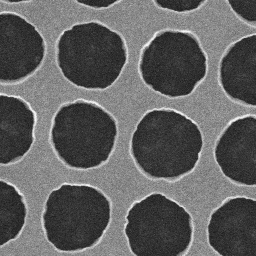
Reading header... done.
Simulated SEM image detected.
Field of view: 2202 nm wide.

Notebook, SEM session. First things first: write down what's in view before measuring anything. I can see holes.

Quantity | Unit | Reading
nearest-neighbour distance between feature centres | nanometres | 696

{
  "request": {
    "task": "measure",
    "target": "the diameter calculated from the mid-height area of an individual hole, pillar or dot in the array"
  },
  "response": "575 nanometres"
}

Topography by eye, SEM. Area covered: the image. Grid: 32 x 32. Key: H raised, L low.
HHHHHHHHHHHLLLHHHHHHLLLLLHHHHLLL
HHHHHHHHHHHHHHHHHHHHHHHHHHHHHLLL
LLLHHHHHHHHHHHHHHHHHHHHHHHHHHHHL
LLLLHHHHHLLLLHHHHHHHHHHHHHHHHHHH
LLLLLHHHLLLLLLLHHHHHLLLLHHHHHHHL
LLLLLHHLLLLLLLLLHHHLLLLLLHHHHLLL
LLLLLHHLLLLLLLLLHHLLLLLLLHHHLLLL
LLLLLHHLLLLLLLLLHHLLLLLLLLHHLLLL
LLLLLHHHLLLLLLLHHHLLLLLLLLHLLLLL
LLLHHHHHLLLLLLLHHHLLLLLLLHHHLLLL
HHHHHHHHHLLLLLHHHHLLLLLLLHHHLLLL
HHHHHHHHHHHHHHHHHHHHLLLLHHHHLLLL
LLLHHHHHHHHHHHHHHHHHHHHHHHHHHLLL
LLLLHHHHLLLLHHHHHHHHHHHHHHHHHHHH
LLLLHHHLLLLLLLHHHHLLLLLHHHHHHHHH
LLLLHHHLLLLLLLHHHLLLLLLLHHHHHLLL
LLLLHHLLLLLLLLLHHLLLLLLLLHHHLLLL
LLLLHHLLLLLLLLHHLLLLLLLLLHHLLLLL
LLLLHHHLLLLLLLHHLLLLLLLLLHHLLLLL
LLLHHHHLLLLLLLHHHLLLLLLLLHHLLLLL
HHHHHHHHLLLLHHHHHLLLLLLLHHHLLLLL
HHHHHHHHHHHHHHHHHHLLLLLLHHHHLLLL
HHHHHHHHHHHHHHHHHHHHHHHHHHHHHLLL
LLHHHHHLLLLHHHHHHHHHHHHHHHHHHHHH
LLLHHHLLLLLLLHHHHHHLHHHHHHHHHHHH
LLLHHHLLLLLLLLHHHLLLLLHHHHHHLLLL
LLLHHHLLLLLLLLHHLLLLLLLHHHHLLLLL
LLLHHLLLLLLLLLHHLLLLLLLLHHLLLLLL
LLLHHHLLLLLLLHHHLLLLLLLLHHLLLLLL
LLHHHHLLLLLLLHHHLLLLLLLLHHLLLLLL
HHHHHHHLLLLLHHHHLLLLLLLLHHLLLLLL
HHHHHHHHHHHHHHHHHLLLLLLHHHHLLLLL